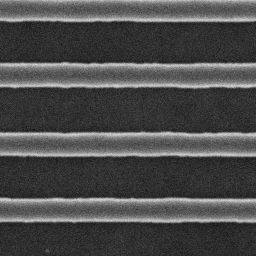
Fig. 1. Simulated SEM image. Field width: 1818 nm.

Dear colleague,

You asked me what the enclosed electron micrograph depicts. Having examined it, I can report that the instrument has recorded lines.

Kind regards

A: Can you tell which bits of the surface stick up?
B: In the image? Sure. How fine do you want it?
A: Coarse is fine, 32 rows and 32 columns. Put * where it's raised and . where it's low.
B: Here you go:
********************************
********************************
********************************
................................
................................
................................
................................
................................
********************************
********************************
********************************
................................
................................
................................
................................
................................
................................
********************************
********************************
................................
................................
................................
................................
................................
................................
********************************
********************************
********************************
................................
................................
................................
................................